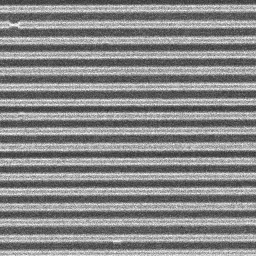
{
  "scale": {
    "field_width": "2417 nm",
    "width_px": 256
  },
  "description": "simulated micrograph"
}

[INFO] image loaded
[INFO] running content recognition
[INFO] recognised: parallel lines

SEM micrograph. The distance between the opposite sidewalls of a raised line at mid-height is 7.25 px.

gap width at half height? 8.25 px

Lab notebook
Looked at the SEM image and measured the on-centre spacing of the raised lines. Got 145 nm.